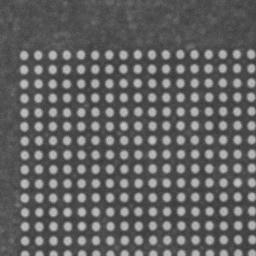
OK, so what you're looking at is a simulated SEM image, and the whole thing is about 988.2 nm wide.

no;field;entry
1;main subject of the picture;a regular array of raised bodies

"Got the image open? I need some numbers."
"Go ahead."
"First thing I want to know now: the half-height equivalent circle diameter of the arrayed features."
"8.29 pixels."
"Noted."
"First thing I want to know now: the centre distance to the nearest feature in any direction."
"53.4 nanometers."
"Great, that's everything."